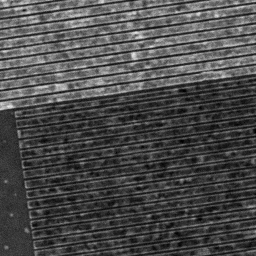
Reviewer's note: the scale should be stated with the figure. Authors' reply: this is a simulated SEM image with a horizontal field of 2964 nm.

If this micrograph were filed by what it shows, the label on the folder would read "parallel lines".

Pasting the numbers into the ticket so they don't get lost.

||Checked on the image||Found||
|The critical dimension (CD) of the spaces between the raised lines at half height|37.3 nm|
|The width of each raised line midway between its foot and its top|81.7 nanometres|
